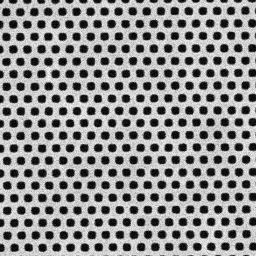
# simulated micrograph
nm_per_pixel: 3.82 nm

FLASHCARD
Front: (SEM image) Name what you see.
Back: a regular array of holes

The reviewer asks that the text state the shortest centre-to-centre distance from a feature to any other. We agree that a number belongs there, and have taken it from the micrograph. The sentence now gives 52.7 nm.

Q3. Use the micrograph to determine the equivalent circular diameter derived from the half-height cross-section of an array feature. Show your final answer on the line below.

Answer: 33.6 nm